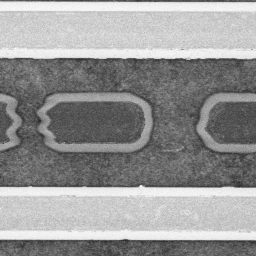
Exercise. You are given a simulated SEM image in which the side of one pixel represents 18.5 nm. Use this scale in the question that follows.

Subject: one or a few lines or trenches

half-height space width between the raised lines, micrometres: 0.849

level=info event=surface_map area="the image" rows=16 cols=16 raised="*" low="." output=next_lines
************....
****************
****************
................
................
................
*..******....***
*..******....***
*..******....***
................
................
................
****************
****************
****************
................